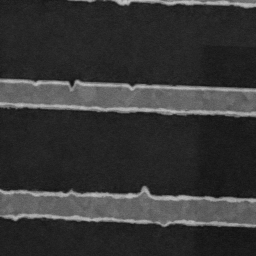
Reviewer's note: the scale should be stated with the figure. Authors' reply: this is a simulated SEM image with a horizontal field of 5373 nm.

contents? one or a few lines or trenches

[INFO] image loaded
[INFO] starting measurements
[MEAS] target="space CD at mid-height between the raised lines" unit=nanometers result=1820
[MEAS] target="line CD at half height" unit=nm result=490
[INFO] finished